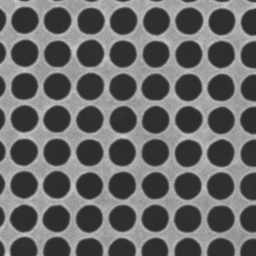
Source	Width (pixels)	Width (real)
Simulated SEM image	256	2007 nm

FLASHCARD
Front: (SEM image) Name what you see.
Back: a regular array of holes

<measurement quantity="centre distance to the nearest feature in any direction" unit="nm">255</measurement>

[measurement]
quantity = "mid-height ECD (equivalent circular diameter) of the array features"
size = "0.216 microns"